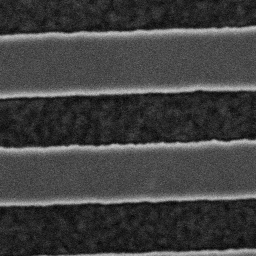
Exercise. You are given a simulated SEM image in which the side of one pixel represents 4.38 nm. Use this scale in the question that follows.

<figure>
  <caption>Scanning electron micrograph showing lines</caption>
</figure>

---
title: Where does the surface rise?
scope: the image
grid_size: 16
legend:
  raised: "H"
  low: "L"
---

LLLLLLLLLLLLLLLL
LLLLLLLLLLLLLLLL
HHHHHHHHHHHHHHHH
HHHHHHHHHHHHHHHH
HHHHHHHHHHHHHHHH
HHHHHHHHHHHHHHHH
LLLLLLLLLLLLLLLL
LLLLLLLLLLLLLLLL
LLLLLLLLLLLLLLLL
HHHHHHHHHHHHHHHH
HHHHHHHHHHHHHHHH
HHHHHHHHHHHHHHHH
HHHHHHHHHHHHHHLL
LLLLLLLLLLLLLLLL
LLLLLLLLLLLLLLLL
LLLLLLLLLLLLLLLL